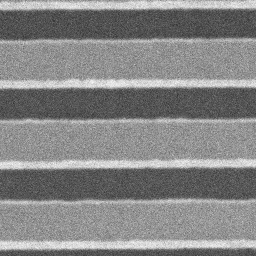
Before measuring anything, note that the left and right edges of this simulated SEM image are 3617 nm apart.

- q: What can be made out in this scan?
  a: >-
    lines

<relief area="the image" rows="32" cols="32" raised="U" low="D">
UUUUUUUUUUUUUUUUUUUUUUUUUUUUUUUU
DDDDDDDDDDDDDDDDDDDDDDDDDDDDDDDD
DDDDDDDDDDDDDDDDDDDDDDDDDDDDDDDD
DDDDDDDDDDDDDDDDDDDDDDDDDDDDDDDD
DDDDDDDDDDDDDDDDDDDDDDDDDDDDDDDD
UUUUUUUUUUUUUUUUUUUUUUUUUUUUUUUU
UUUUUUUUUUUUUUUUUUUUUUUUUUUUUUUU
UUUUUUUUUUUUUUUUUUUUUUUUUUUUUUUU
UUUUUUUUUUUUUUUUUUUUUUUUUUUUUUUU
UUUUUUUUUUUUUUUUUUUUUUUUUUUUUUUU
UUUUUUUUUUUUUUUUUUUUUUUUUUUUUUUU
DDDDDDDDDDDDDDDDDDDDDDDDDDDDDDDD
DDDDDDDDDDDDDDDDDDDDDDDDDDDDDDDD
DDDDDDDDDDDDDDDDDDDDDDDDDDDDDDDD
DDDDDDDDDDDDDDDDDDDDDDDDDDDDDDDD
UUUUUUUUUUUUUUUUUUUUUUUUUUUUUUUU
UUUUUUUUUUUUUUUUUUUUUUUUUUUUUUUU
UUUUUUUUUUUUUUUUUUUUUUUUUUUUUUUU
UUUUUUUUUUUUUUUUUUUUUUUUUUUUUUUU
UUUUUUUUUUUUUUUUUUUUUUUUUUUUUUUU
UUUUUUUUUUUUUUUUUUUUUUUUUUUUUUUU
DDDDDDDDDDDDDDDDDDDDDDDDDDDDDDDD
DDDDDDDDDDDDDDDDDDDDDDDDDDDDDDDD
DDDDDDDDDDDDDDDDDDDDDDDDDDDDDDDD
DDDDDDDDDDDDDDDDDDDDDDDDDDDDDDDD
UUUUUUUUUUUUUUUUUUUUUUUUUUUUUUUU
UUUUUUUUUUUUUUUUUUUUUUUUUUUUUUUU
UUUUUUUUUUUUUUUUUUUUUUUUUUUUUUUU
UUUUUUUUUUUUUUUUUUUUUUUUUUUUUUUU
UUUUUUUUUUUUUUUUUUUUUUUUUUUUUUUU
UUUUUUUUUUUUUUUUUUUUUUUUUUUUUUUU
DDDDDDDDDDDDDDDDDDDDDDDDDDDDDDDD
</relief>